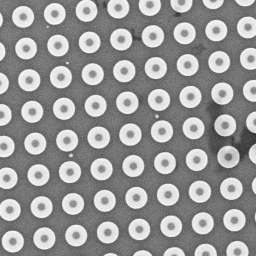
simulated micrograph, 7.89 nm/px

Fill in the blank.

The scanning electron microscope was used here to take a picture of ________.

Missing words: an array of small figures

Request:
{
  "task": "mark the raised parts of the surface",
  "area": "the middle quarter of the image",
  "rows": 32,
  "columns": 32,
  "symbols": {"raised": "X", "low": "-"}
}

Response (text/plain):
-----XXXX----XXXX---XXXXX---XXXX
X----XXXXX--XXXXXX--XXXXXX---XXX
XX---XXXXX--XXXXXX---XXXX----XXX
XX---XXXXX---XXXX-----XX--------
XX---XXXX-----------------------
X-------------------------------
-----------------------XX-----XX
--------------XXX-----XXXX---XXX
------XXXX---XXXXX---XXXXX---XXX
XX---XXXXX---XXXXX---XXXXX---XXX
XXX--XXXXX---XXXXX----XXXX----XX
XXX--XXXXX----XXXX-----XX-------
XX----XXXX----------------------
X-------------------------------
-----------------------XXX----XX
---------------XXX----XXXXX---XX
-------XXXX---XXXXX---XXXXX---XX
XXX---XXXXX---XXXXX---XXXXX---XX
XXX---XXXXX---XXXXX---XXXXX----X
XXX---XXXXX----XXXX-------------
XXX----XXX----------------------
XX------------------------------
------------------------XXX----X
----------------XXX----XXXXX---X
-X-----XXXX----XXXXX---XXXXX---X
XXXX---XXXXX---XXXXX---XXXXX---X
XXXX---XXXXX---XXXXX---XXXX-----
XXXX---XXXXX----XXX-------------
XXXX----XXX---------------------
-X------------------------------
------------------------XXXX----
----------------XXXX----XXXX---X